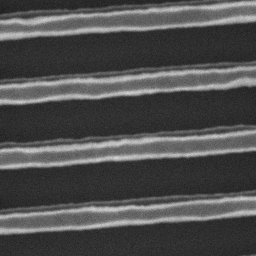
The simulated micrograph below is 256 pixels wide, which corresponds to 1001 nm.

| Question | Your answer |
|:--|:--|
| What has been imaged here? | lines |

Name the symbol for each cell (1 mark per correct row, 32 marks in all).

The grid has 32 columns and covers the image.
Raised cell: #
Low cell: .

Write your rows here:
...........................#####
..............##################
.###############################
######################..........
#####...........................
................................
................................
................................
.............................###
...............#################
...#############################
####################............
#######.........................
................................
................................
................................
..............................##
...............#################
.###############################
#########################.......
##########......................
................................
................................
................................
................................
....................############
.....###########################
#########################.......
############....................
................................
................................
................................